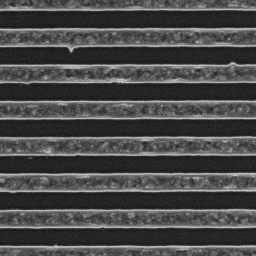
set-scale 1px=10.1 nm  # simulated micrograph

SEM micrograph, parallel lines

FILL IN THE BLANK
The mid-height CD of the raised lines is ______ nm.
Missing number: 181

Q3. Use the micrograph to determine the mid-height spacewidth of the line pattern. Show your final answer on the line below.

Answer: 190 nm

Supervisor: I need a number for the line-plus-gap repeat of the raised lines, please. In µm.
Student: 0.368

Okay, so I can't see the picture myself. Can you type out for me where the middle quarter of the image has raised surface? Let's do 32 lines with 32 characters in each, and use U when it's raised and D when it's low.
UUUUUUUUUUUUUUUUUUUUUUUUUUUUUUUU
UUUUUUUUUUUUUUUUUUUUUUUUUUUUUUUU
UUUUUUUUUUUUUUUUUUUUUUUUUUUUUUUU
UUUUUUUUUUUUUUUUUUUUUUUUUUUUUUUU
DDDUUUUDDDDUDDDUUUUUDUUUUUUUDDUU
DDDDDDDDDDDDDDDDDDDDDDDDDDDDDDDD
DDDDDDDDDDDDDDDDDDDDDDDDDDDDDDDD
DDDDDDDDDDDDDDDDDDDDDDDDDDDDDDDD
DDDDDDDDDDDDDDDDDDDDDDDDDDDDDDDD
DDDUUUDDDDDDDDUUDDDDDUUUUDDDDDUU
UUUUUUUUUUUUUUUUUUUUUUUUUUUUUUUU
UUUUUUUUUUUUUUUUUUUUUUUUUUUUUUUU
UUUUUUUUUUUUUUUUUUUUUUUUUUUUUUUU
UUUUUUUUUUUUUUUUUUUUUUUUUUUUUUUU
DDDDDDDDDDDDDDDDDDDDDDDDDDDDDDDD
DDDDDDDDDDDDDDDDDDDDDDDDDDDDDDDD
DDDDDDDDDDDDDDDDDDDDDDDDDDDDDDDD
DDDDDDDDDDDDDDDDDDDDDDDDDDDDDDDD
DDDDDDDDDDDDDDDDDDDDDDDDDUUUUUUU
UUUUUUUUUUUUUUUUUUUUUUUUUUUUUUUU
UUUUUUUUUUUUUUUUUUUUUUUUUUUUUUUU
UUUUUUUUUUUUUUUUUUUUUUUUUUUUUUUU
UUUUUUUUUUUUUUUUUUUUUUUUUUUUUUDU
DDDDDDDDDDDDDDDDDDDDDDDDDDDDDDDD
DDDDDDDDDDDDDDDDDDDDDDDDDDDDDDDD
DDDDDDDDDDDDDDDDDDDDDDDDDDDDDDDD
DDDDDDDDDDDDDDDDDDDDDDDDDDDDDDDD
DDDDDDDDDDDDDUDUUDUUUUUUUUDDUUDD
UUUUUUUUUUUUUUUUUUUUUUUUUUUUUUUU
UUUUUUUUUUUUUUUUUUUUUUUUUUUUUUUU
UUUUUUUUUUUUUUUUUUUUUUUUUUUUUUUU
UUUUUUUUUUUUUUUUUUUUUUUUUUUUUUUU